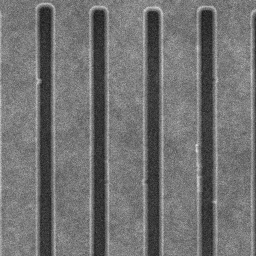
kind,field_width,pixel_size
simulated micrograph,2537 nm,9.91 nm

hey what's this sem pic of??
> parallel lines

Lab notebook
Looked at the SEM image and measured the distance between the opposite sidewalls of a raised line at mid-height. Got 0.383 micrometres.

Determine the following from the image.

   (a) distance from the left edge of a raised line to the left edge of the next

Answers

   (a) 534 nm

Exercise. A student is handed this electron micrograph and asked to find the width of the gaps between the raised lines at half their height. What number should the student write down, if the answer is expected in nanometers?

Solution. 147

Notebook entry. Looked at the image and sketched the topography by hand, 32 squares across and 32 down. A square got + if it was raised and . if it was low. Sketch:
++++++++++++++++++++++++++++++++
+++++..+++++.+++++..+++++..+++++
+++++..++++..+++++..+++++..+++++
+++++..++++..+++++..+++++..+++++
+++++..++++..+++++..+++++..+++++
+++++..++++..+++++..+++++..+++++
+++++..++++..+++++..+++++..+++++
+++++..++++..+++++..+++++..+++++
+++++..++++..+++++..+++++..+++++
+++++..++++..+++++..+++++..+++++
+++++..++++..+++++..+++++..+++++
+++++..++++..+++++..+++++..+++++
+++++..++++..+++++..+++++..+++++
+++++..++++..+++++..+++++..+++++
+++++..++++..+++++..+++++..+++++
+++++..++++..+++++..+++++..+++++
+++++..++++..+++++..+++++..+++++
+++++..++++..+++++..+++++..+++++
+++++..++++..+++++..+++++..+++++
+++++..++++..+++++..+++++..+++++
+++++..++++..+++++..+++++..+++++
+++++..++++..+++++..+++++..+++++
+++++..++++..+++++..+++++..+++++
+++++..++++..+++++..+++++..+++++
+++++..++++..+++++..+++++..+++++
+++++..++++..+++++..+++++..+++++
+++++..++++..+++++..+++++..+++++
+++++..++++..+++++..+++++..+++++
+++++..++++..+++++..+++++..+++++
+++++..++++..+++++..+++++..+++++
+++++..++++..+++++..+++++..+++++
+++++..++++..+++++..+++++..+++++